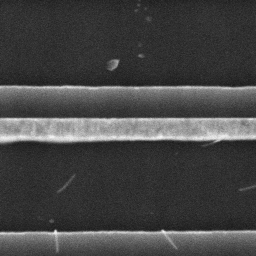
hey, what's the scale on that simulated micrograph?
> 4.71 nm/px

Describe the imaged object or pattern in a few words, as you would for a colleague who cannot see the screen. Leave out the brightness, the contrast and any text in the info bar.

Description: lines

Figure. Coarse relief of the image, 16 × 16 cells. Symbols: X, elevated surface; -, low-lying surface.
----------------
----------------
----------------
----------------
----------------
XXXXXXXXXXXXXXXX
XXXXXXXXXXXXXXXX
XXXXXXXXXXXXXXXX
XXXXXXXXXXXXXXXX
----------------
----------------
----------------
----------------
----------------
----------------
XXXXXXXXXXXXXXXX